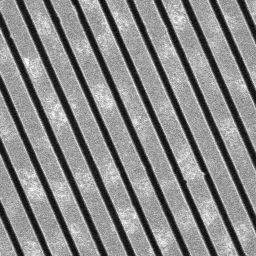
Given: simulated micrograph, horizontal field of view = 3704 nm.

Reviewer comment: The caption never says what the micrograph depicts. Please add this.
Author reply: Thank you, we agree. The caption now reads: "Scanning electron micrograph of parallel lines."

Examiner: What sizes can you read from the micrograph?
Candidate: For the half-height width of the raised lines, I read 270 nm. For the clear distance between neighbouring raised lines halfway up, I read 0.0977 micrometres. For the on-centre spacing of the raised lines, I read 0.366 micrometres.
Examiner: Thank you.